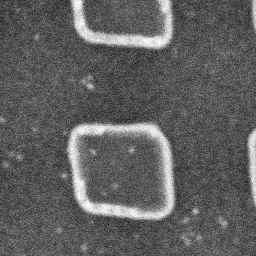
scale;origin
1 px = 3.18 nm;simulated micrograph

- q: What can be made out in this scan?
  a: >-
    raised bodies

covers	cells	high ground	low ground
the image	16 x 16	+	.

.....++++++.....
.....++++++.....
......++++......
................
................
................
................
................
.....+++++......
....++++++......
.....++++++.....
.....++++++.....
.....++++++.....
........++......
................
................